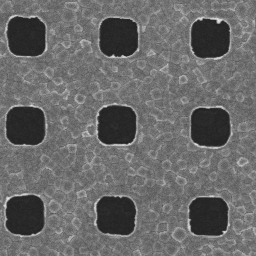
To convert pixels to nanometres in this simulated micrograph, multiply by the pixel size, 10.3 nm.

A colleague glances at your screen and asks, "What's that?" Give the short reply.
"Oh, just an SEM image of a regular array of holes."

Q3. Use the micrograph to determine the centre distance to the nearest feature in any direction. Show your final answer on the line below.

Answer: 89.2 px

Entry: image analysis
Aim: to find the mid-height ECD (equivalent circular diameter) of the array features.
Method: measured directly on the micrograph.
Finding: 431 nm